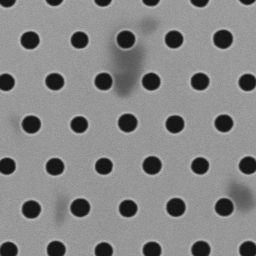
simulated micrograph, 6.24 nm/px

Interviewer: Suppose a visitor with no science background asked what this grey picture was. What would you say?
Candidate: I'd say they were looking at a regular array of holes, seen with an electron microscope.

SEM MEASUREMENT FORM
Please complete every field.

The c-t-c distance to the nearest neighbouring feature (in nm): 298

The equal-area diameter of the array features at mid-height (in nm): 110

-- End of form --